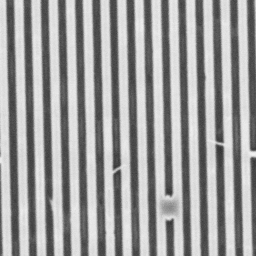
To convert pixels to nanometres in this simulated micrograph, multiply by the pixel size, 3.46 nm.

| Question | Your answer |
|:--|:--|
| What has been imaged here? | parallel lines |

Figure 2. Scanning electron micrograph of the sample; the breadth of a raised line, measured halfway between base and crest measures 29.8 nm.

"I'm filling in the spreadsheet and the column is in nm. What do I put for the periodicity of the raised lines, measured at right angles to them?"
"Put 59.5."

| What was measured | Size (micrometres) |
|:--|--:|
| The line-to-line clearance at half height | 0.0298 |